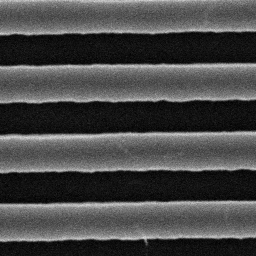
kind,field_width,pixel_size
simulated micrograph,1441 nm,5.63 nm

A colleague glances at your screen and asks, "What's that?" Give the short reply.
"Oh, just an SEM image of lines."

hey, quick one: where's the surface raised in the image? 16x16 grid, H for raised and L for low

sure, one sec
HHHHHHHHHHHHHHHH
HHHHHHHHHHHHHHHH
LLLLLLLLLLLLLLLL
LLLLLLLLLLLLLLLL
HHHHHHHHHHHHHHHH
HHHHHHHHHHHHHHHH
LLLLLLLLLLLLLLLL
LLLLLLLLLLLLLLLL
HHHHHHHHHHHHHHHH
HHHHHHHHHHHHHHHH
HHHHHHHHHHHHHHHH
LLLLLLLLLLLLLLLL
LLLLLLLLLLLLLLLL
HHHHHHHHHHHHHHHH
HHHHHHHHHHHHHHHH
LLLLLLLLLLLLLLLL